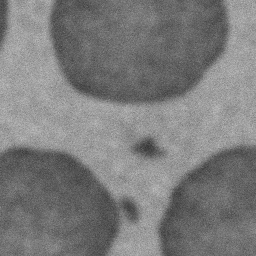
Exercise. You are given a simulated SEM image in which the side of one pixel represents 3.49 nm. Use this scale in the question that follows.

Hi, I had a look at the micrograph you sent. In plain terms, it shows holes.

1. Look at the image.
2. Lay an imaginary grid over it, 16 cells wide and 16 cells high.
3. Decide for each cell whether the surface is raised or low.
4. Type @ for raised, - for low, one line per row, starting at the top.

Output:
-@@-----------@@
-@@-----------@@
@@@-----------@@
@@@-----------@@
@@@@---------@@@
@@@@@-------@@@@
@@@@@@@@-@@@@@@@
@@@@@@@@@@@@@@@@
@@@@@@@@@@@@@@@@
----@@@@@@@@@@--
------@@@@@@----
------@@@@@-----
-------@@@@-----
--------@@------
-------@@@------
-------@@@------